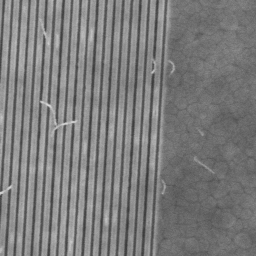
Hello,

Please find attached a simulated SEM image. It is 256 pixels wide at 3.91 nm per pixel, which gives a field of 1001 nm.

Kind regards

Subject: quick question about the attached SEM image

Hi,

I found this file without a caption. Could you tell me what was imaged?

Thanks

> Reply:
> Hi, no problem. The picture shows parallel lines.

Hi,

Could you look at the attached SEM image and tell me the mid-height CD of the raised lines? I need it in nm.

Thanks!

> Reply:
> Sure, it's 24.4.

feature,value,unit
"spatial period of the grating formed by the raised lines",8.52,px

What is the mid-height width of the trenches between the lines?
10.2 nanometres